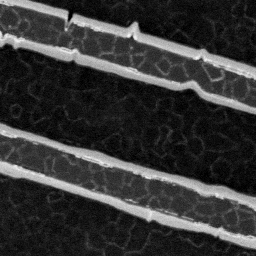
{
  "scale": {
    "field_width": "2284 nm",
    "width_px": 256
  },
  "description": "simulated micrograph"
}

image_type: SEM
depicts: one or a few lines or trenches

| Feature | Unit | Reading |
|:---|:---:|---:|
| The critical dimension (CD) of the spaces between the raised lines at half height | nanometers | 790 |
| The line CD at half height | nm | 344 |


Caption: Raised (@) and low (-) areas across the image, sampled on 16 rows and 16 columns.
@@@-------------
@@@@@@----------
@@@@@@@@@-------
-----@@@@@@@@---
--------@@@@@@@@
------------@@@@
--------------@@
----------------
@@--------------
@@@@@-----------
@@@@@@@@--------
---@@@@@@@@@----
------@@@@@@@@@-
----------@@@@@@
-------------@@@
----------------